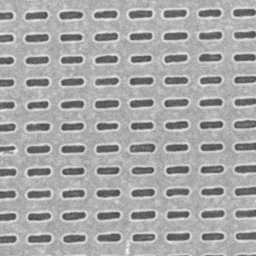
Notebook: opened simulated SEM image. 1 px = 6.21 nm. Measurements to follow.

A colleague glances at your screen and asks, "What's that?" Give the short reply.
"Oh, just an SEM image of a regular array of holes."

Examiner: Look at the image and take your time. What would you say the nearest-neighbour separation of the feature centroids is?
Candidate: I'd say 138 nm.